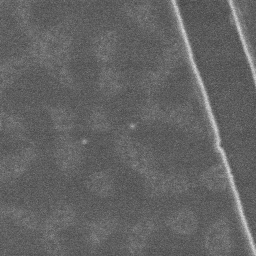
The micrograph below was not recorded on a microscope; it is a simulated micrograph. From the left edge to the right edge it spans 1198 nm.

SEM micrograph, one or a few lines or trenches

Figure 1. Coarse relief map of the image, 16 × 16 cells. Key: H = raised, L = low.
HHHHHHHHHHHLLLLH
HHHHHHHHHHHLLLLH
HHHHHHHHHHHHLLLH
HHHHHHHHHHHHLLLH
HHHHHHHHHHHHLLLL
HHHHHHHHHHHHHLLL
HHHHHHHHHHHHHLLL
HHHHHHHHHHHHHLLL
HHHHHHHHHHHHHHLL
HHHHHHHHHHHHHHLL
HHHHHHHHHHHHHHLL
HHHHHHHHHHHHHHHL
HHHHHHHHHHHHHHHL
HHHHHHHHHHHHHHHL
HHHHHHHHHHHHHHHH
HHHHHHHHHHHHHHHH